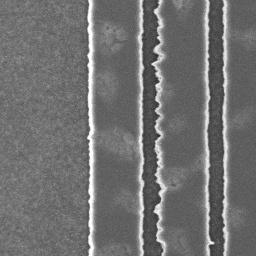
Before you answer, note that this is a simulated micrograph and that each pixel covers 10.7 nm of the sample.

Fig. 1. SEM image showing one or a few lines or trenches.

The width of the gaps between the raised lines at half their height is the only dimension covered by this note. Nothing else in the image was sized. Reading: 182 nm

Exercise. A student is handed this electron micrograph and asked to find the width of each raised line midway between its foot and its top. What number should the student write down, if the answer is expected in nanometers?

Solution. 548